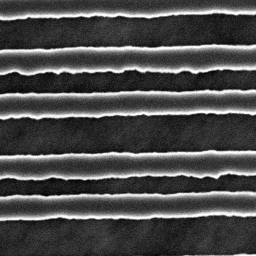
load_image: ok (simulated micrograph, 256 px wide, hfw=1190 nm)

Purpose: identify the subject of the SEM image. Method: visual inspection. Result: lines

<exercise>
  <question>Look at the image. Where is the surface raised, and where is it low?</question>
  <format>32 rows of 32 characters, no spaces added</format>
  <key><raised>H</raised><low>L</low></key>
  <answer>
HHHHHHHHHHHHHHHHHHHHHHHHHHHHHHHH
HHHHHHHHHHHHHHHHHHHHHHHHHHHLHHHH
LLLLLLLLLLLLLLLLLLLLLLLLLLLLLLLL
LLLLLLLLLLLLLLLLLLLLLLLLLLLLLLLL
LLLLLLLLLLLLLLLLLLLLLLLLLLLLLLLL
LLLLLLLLLLLLLLLLLLLLLLLLLLLLLLLL
HHHHHHHHHHHHHHHHHHHHHHHHHHHHHHHH
HHHHHHHHHHHHHHHHHHHHHHHHHHHHHHHH
HHHHHHHHHHHHHHHHHHHHHHHHHHHHHHHH
LLLLLLLLLLLLLLLLLLLLLLLLLLLLLLLL
LLLLLLLLLLLLLLLLLLLLLLLLLLLLLLLL
LLLLLLLLLLLLLLLLLLLLLLLLLHHHHHHH
HHHHHHHHHHHHHHHHHHHHHHHHHHHHHHHH
HHHHHHHHHHHHHHHHHHHHHHHHHHHHHHHH
HHHHHHHHHHHHHLLLLLLLLLLLLLLLLLLL
LLLLLLLLLLLLLLLLLLLLLLLLLLLLLLLL
LLLLLLLLLLLLLLLLLLLLLLLLLLLLLLLL
LLLLLLLLLLLLLLLLLLLLLLLLLLLLLLLL
LLLLLLLLLLLLLLLLLLLLLLLLLLLLLLLL
LLLLLLHHHHHHHHHHHHHHHHHHHHHHHHHH
HHHHHHHHHHHHHHHHHHHHHHHHHHHHHHHH
HHHHHHHHHHHHHHHHHHHHHHHHHHHHHHHH
LLLLLLLLLLLLLLLLLLLLLLLLLLLLLLLL
LLLLLLLLLLLLLLLLLLLLLLLLLLLLLLLL
LLLLLLLLHHHHHHHHHHHHHHHHHHHHHHHH
HHHHHHHHHHHHHHHHHHHHHHHHHHHHHHHH
HHHHHHHHHHHHHHHHHHHHHHHHHHHHHHHH
LLLLLLLLLLLLLLLLLLLLLLLLLLLLLLLL
LLLLLLLLLLLLLLLLLLLLLLLLLLLLLLLL
LLLLLLLLLLLLLLLLLLLLLLLLLLLLLLLL
LLLLLLLLLLLLLLLLLLLLLLLLLLLLLLLL
LLLLLLLLLLLLLLLLLLLLLLLLLLLLLLLL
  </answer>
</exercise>